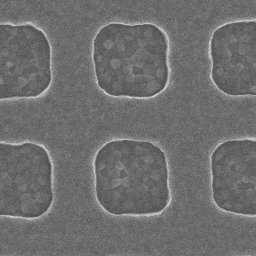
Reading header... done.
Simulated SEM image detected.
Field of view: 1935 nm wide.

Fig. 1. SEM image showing holes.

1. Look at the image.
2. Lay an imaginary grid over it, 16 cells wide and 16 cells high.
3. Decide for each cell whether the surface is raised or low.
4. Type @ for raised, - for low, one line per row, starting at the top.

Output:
@@@@@@@@@@@@@@@@
@@@@@@@-@@@@@@--
---@@@----@@@---
---@@@----@@@---
---@@@----@@@---
---@@@----@@@@--
@@@@@@@@@@@@@@@@
@@@@@@@@@@@@@@@@
@@@@@@@@@@@@@@@@
---@@@----@@@---
---@@@----@@@---
---@@@----@@@---
---@@@-----@@---
@-@@@@@@@@@@@@@@
@@@@@@@@@@@@@@@@
@@@@@@@@@@@@@@@@